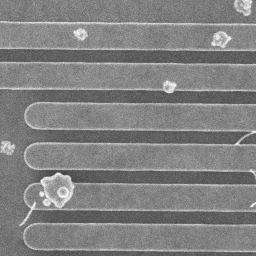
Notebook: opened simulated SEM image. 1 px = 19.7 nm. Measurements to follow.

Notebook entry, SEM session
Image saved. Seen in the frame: groups of lines, slits or small figures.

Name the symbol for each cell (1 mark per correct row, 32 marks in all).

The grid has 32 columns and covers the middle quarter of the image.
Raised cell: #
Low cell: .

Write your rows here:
################################
################################
################################
################################
################################
################################
.........................###...#
................................
................................
................................
################################
################################
################################
################################
################################
################################
.............###################
................................
................................
................................
################################
################################
################################
################################
################################
################################
..............######..##########
................................
#...............................
##..............................
################################
################################